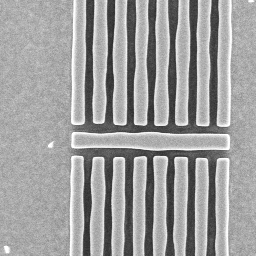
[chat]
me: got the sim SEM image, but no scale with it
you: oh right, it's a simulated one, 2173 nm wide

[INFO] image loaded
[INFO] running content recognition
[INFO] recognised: groups of lines, slits or small figures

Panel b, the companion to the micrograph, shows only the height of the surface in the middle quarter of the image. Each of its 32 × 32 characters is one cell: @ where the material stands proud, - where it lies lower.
--@@@--@@@@-@@@@--@@---@@@--@@@-
--@@@--@@@@-@@@---@@@--@@@--@@@-
--@@@--@@@@-@@@---@@@--@@@--@@@-
--@@@--@@@---@@---@@@--@@@--@@@-
--@@@--@@@---@@---@@@--@@@--@@@-
--@@@--@@@---@@---@@@--@@@--@@@-
--@@@--@@@---@@---@@@--@@@--@@@-
--@@@--@@@@-@@@---@@@--@@@--@@@-
--@@@--@@@@-@@@@--@@@--@@@--@@@-
--@@@--@@@@-@@@@--@@@--@@@--@@@-
--@@@--@@@--@@@@--@@@--@@@--@@@-
--@@@--@@@--@@@@--@@@--@@@--@@@-
--@@@--@@@--@@@---@@@--@@@--@@@-
--@@@--@@@--@@@---@@@--@@@--@@@-
--@@@--@@@--@@@---@@@--@@@--@@@-
--------------------------------
--------------------------------
--@@@@@@@@@@@@@@@@@@@@@@@@@@--@@
--@@@@@@@@@@@@@@@@@@@@@@@@@@@@@@
--@@@@@@@@@@@@@@@@@@@@@@@@@@@@@@
--@@@@@@@@@@@@@@@@@@@@@@@@@@@@@@
--------------------------------
--------------------------------
--@@@--@@@---@@---@@@--@@@--@@@-
--@@@--@@@--@@@---@@@--@@@--@@@-
--@@@--@@@--@@@---@@---@@@--@@@-
--@@@--@@@--@@@---@@---@@@--@@@-
--@@@--@@@--@@@--@@@---@@@--@@@-
--@@@--@@@--@@@--@@@---@@---@@@-
--@@@--@@@--@@@--@@@---@@---@@@-
--@@@--@@@--@@@--@@@---@@---@@@-
--@@@--@@@--@@@--@@@---@@---@@@-